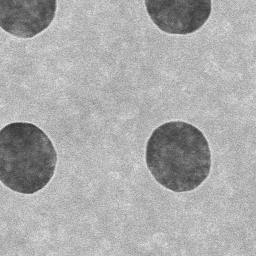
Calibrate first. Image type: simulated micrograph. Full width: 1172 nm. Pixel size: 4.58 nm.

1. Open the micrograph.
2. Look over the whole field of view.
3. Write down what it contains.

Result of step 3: holes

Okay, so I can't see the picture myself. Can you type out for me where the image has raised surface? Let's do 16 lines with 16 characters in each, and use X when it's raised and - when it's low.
---XXXXXX----XXX
---XXXXXXX---XXX
XXXXXXXXXXXXXXXX
XXXXXXXXXXXXXXXX
XXXXXXXXXXXXXXXX
XXXXXXXXXXXXXXXX
XXXXXXXXXXXXXXXX
XXXXXXXXXXXXXXXX
---XXXXXX----XXX
---XXXXXX----XXX
---XXXXXX----XXX
---XXXXXXX--XXXX
XXXXXXXXXXXXXXXX
XXXXXXXXXXXXXXXX
XXXXXXXXXXXXXXXX
XXXXXXXXXXXXXXXX